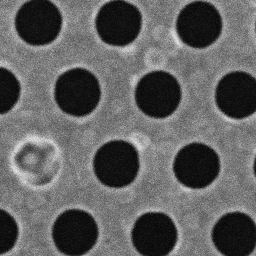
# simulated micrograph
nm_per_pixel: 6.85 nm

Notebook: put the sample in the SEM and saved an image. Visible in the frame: holes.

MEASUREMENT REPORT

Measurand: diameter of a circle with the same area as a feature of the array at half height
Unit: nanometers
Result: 331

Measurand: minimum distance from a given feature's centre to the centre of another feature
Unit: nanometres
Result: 549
